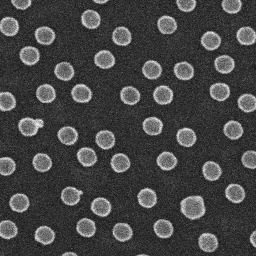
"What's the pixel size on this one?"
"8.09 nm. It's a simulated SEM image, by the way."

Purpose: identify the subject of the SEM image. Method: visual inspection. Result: a regular array of raised bodies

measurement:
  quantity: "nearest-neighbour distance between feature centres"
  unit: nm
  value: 250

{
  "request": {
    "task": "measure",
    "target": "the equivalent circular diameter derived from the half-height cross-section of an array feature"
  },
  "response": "144 nanometres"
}